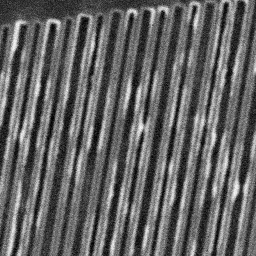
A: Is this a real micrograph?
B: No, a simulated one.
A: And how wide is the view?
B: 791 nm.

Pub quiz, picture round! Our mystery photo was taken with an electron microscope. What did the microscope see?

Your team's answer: parallel lines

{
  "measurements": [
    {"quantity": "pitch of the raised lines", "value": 0.0468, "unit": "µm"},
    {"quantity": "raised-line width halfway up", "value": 8.16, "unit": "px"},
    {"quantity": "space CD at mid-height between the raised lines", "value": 19.8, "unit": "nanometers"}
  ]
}